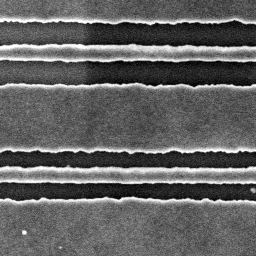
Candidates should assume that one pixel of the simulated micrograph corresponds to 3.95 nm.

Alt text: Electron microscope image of lines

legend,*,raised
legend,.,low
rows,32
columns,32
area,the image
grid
********************************
********************************
********************************
................................
................................
................................
********************************
...*.************.******.*******
................................
................................
.............*..*...............
********************************
********************************
********************************
********************************
********************************
********************************
********************************
********************************
................................
................................
********************************
********************************
................................
................................
********************************
********************************
********************************
********************************
********************************
********************************
********************************